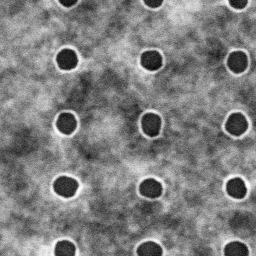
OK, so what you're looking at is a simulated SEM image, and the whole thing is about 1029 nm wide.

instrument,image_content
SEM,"a regular array of holes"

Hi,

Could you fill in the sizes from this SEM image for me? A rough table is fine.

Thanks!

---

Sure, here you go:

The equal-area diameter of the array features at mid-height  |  0.0955 micrometres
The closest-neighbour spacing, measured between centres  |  256 nanometres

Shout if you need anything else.